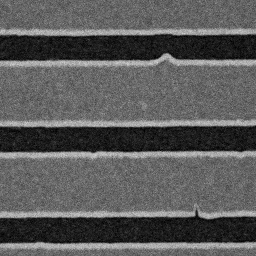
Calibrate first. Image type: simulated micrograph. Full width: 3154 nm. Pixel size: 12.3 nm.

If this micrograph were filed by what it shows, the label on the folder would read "one or a few lines or trenches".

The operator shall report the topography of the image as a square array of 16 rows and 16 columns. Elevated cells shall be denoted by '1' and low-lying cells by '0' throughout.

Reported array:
1111111111111111
1111111111111111
0000000000000000
0000000000000000
1111111111111111
1111111111111111
1111111111111111
1111111111111111
0000000000000000
0000000000000000
1111111111111111
1111111111111111
1111111111111111
0000000000000000
0000000000000000
1111111111111111